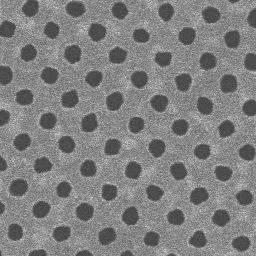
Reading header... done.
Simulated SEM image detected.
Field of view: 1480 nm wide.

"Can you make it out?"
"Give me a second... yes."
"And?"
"a regular array of holes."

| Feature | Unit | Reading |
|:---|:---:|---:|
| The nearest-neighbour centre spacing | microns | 0.18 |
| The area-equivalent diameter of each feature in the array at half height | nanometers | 97.4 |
